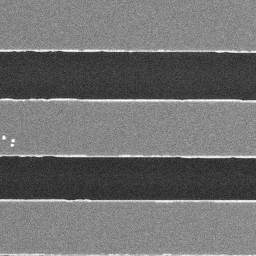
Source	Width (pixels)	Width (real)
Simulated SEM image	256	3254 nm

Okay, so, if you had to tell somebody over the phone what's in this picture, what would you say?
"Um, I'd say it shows lines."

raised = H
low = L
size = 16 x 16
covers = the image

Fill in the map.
HHHHHHHHHHHHHHHH
HHHHHHHHHHHHHHHH
HHHHHHHHHHHHHHHH
LLLLLLLLLLLLLLLL
LLLLLLLLLLLLLLLL
LLLLLLLLLLLLLLLL
HHHHHHHHHHHHHHHH
HHHHHHHHHHHHHHHH
HHHHHHHHHHHHHHHH
HHHHHHHHHHHHHHHH
LLLLLLLLLLLLLLLL
LLLLLLLLLLLLLLLL
HHHHHHLLLLLLLLLL
HHHHHHHHHHHHHHHH
HHHHHHHHHHHHHHHH
HHHHHHHHHHHHHHHH